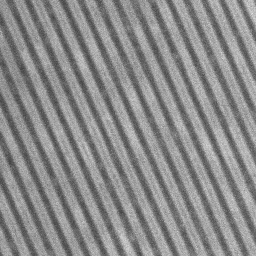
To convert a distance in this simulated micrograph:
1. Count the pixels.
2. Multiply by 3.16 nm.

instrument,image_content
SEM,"parallel lines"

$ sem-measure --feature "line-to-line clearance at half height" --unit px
8.54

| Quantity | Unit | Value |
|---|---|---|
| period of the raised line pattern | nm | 51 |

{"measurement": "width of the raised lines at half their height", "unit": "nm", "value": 24.2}